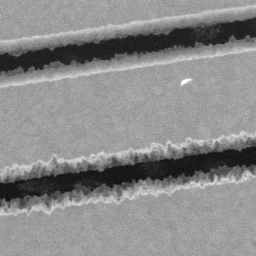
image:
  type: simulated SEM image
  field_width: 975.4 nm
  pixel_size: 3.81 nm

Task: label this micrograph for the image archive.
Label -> one or a few lines or trenches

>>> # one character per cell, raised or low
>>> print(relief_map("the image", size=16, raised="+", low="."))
++++++++++++++++
++++++++++......
+++.............
...........+++++
....++++++++++++
++++++++++++++++
++++++++++++++++
++++++++++++++++
++++++++++++++++
++++++++++......
+++.............
...........+++++
....++++++++++++
++++++++++++++++
++++++++++++++++
++++++++++++++++